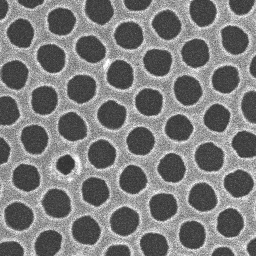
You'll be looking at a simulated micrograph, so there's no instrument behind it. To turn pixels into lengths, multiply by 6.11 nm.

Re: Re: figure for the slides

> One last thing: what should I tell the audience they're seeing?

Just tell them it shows a regular array of holes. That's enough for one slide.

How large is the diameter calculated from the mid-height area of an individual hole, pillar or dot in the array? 0.175 µm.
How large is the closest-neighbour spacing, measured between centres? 238 nanometres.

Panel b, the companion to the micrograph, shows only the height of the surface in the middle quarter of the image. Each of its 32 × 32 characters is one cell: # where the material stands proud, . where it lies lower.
###########......###.......####.
###########......###......######
###########......#####....######
##.....####.......##########....
#.......###......###########....
#.......####.....##########.....
#.......###########....####.....
#.......##########......####....
##.....###########.......###....
###...####...#####.......####...
#########......###.......#######
#########.......##......########
...#####........####...#########
....####.......###########.....#
.....####......###########......
......####.....##########.......
......###########....####.......
......##########......###.......
.....###########.......####....#
#######....#####.......#########
#######.....####.......#########
######.......###......##########
######.......####....#####..####
..####.......############....###
...###.......###########......##
...####....#####..######......##
..#############....####.......##
.#############......####......##
######...#####.......###......##
#####.....####.......#####...###
####.......###......############
####.......####....#############